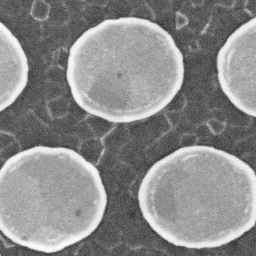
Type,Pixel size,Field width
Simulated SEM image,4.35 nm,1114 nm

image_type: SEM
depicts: raised bodies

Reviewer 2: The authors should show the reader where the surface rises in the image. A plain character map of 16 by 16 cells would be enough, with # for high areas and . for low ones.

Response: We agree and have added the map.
................
.......##.......
#....######...##
#....######...##
##..#######...##
#....######...##
.....#####.....#
................
................
..##.......###..
######....#####.
######...#######
######...#######
######...#######
#####.....#####.
..##............